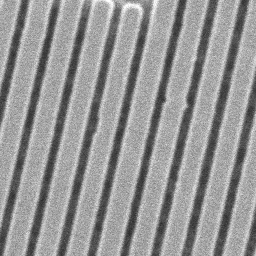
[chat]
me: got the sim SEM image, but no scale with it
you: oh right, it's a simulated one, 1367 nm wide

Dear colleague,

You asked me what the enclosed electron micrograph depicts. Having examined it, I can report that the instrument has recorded parallel lines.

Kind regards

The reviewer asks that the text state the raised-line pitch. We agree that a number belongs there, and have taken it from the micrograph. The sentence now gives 0.163 micrometres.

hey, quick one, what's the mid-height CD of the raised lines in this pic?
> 112 nm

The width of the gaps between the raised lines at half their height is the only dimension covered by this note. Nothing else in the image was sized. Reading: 50.7 nm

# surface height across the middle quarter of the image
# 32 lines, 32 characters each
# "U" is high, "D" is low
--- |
UDDDUUUUUDDUUUUUDDDUUUUUUDDUUUUU
UDDUUUUUUDDUUUUUDDDUUUUUUDDUUUUU
UDDUUUUUDDDUUUUUDDDUUUUUDDDUUUUU
DDDUUUUUDDDUUUUUDDUUUUUUDDUUUUUU
DDDUUUUUDDDUUUUUDDUUUUUUDDUUUUUU
DDUUUUUUDDUUUUUDDDUUUUUUDDUUUUUD
DDUUUUUUDDUUUUUDDDUUUUUDDDUUUUUD
DDUUUUUDDDUUUUUDDUUUUUUDDDUUUUUD
DDUUUUUDDDUUUUUDDUUUUUUDDUUUUUUD
DUUUUUUDDUUUUUUDDUUUUUUDDUUUUUUD
DUUUUUUDDUUUUUDDDUUUUUUDDUUUUUUD
DUUUUUDDDUUUUUDDDUUUUUDDDUUUUUDD
DUUUUUDDDUUUUUDDUUUUUUDDUUUUUUDD
DUUUUUDDDUUUUUDDUUUUUUDDUUUUUDDD
UUUUUUDDDUUUUUDDUUUUUUDDUUUUUDDD
UUUUUDDDUUUUUDDDUUUUUDDDUUUUUDDD
UUUUUDDDUUUUUDDUUUUUUDDUUUUUUDDU
UUUUUDDDUUUUUDDUUUUUUDDUUUUUUDDU
UUUUUDDUUUUUDDDUUUUUUDDUUUUUDDDU
UUUUUDDUUUUUDDDUUUUUDDDUUUUUDDDU
UUUUDDDUUUUUDDUUUUUUDDDUUUUUDDUU
UUUUDDDUUUUUDDUUUUUUDDUUUUUUDDUU
UUUUDDUUUUUDDDUUUUUUDDUUUUUDDDUU
UUUUDDUUUUUDDDUUUUUUDDUUUUUDDDUU
UUUDDDUUUUUDDDUUUUUDDDUUUUUDDUUU
UUUDDDUUUUUDDUUUUUUDDUUUUUUDDUUU
UUUDDUUUUUUDDUUUUUUDDUUUUUDDDUUU
UUUDDUUUUUDDDUUUUUUDDUUUUUDDDUUU
UUDDDUUUUUDDDUUUUUDDDUUUUUDDDUUU
UUDDDUUUUUDDUUUUUUDDUUUUUUDDUUUU
UUDDDUUUUUDDUUUUUUDDUUUUUUDDUUUU
UUDDUUUUUDDDUUUUUUDDUUUUUDDDUUUU